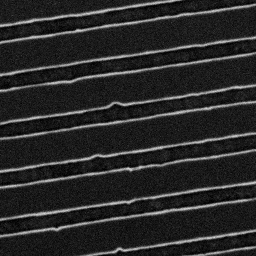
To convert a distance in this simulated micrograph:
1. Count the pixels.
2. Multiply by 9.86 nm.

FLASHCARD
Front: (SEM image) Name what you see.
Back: parallel lines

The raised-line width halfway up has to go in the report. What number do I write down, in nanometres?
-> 322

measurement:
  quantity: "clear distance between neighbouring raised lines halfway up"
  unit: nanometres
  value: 152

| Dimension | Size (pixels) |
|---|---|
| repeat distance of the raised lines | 47.9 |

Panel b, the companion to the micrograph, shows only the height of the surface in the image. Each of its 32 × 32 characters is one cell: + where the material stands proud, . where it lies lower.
+++++++++++++++++++.............
++++++++++++..............++++++
+++++..............+++++++++++++
............++++++++++++++++++++
.....+++++++++++++++++++++++++++
++++++++++++++++++++++++++......
++++++++++++++++++++............
++++++++++++..............++++++
++++++.............+++++++++++++
............++++++++++++++++++++
.....+++++++++++++++++++++++++++
+++++++++++++++++++++++++++.....
++++++++++++++++++++............
+++++++++++++.............++++++
+++++++............+++++++++++++
.............+++++++++++++++++++
......++++++++++++++++++++++++++
+++++++++++++++++++++++++++.....
++++++++++++++++++++............
++++++++++++++.............+++++
++++++...............+++++++++++
.............+++++++++++++++++++
......++++++++++++++++++++++++++
+++++++++++++++++++++++++++.....
++++++++++++++++++++............
++++++++++++++.............+++++
+++++++.............++++++++++++
.............+++++++++++++++++++
.......+++++++++++++++++++++++++
++++++++++++++++++++++++++++....
+++++++++++++++++++++...........
++++++++++++++.............+++++